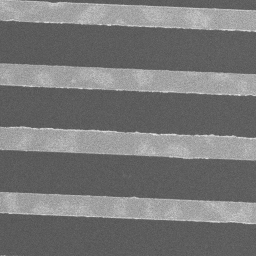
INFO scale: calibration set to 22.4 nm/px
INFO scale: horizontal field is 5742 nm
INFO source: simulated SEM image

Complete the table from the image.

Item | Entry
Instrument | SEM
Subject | one or a few lines or trenches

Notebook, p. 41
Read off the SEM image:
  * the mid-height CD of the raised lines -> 0.462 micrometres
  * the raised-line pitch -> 1440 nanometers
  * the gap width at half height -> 955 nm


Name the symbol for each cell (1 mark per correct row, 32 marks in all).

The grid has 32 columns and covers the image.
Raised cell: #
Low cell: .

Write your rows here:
###########.....................
################################
################################
........................########
................................
................................
................................
................................
#############...................
################################
################################
......................##########
................................
................................
................................
................................
###############.................
################################
################################
....................############
................................
................................
................................
................................
##########......................
################################
################################
.......................#########
................................
................................
................................
................................